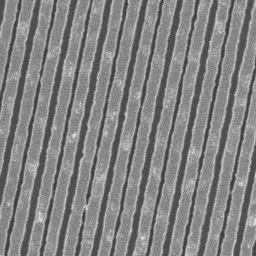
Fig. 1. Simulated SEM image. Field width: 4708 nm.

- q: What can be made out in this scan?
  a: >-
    parallel lines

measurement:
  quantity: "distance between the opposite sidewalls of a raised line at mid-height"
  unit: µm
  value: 0.225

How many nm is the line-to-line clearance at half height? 104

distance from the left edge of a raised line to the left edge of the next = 0.319 um